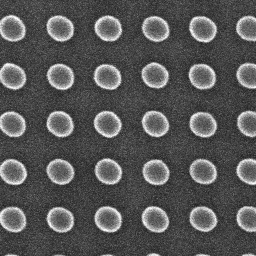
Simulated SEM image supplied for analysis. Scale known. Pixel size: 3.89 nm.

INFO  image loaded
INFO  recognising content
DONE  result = a regular array of raised bodies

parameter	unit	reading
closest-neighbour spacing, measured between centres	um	0.184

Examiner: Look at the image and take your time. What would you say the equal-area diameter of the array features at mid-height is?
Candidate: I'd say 98.9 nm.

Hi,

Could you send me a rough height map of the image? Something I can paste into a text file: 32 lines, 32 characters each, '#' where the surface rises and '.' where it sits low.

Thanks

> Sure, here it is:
................................
................................
##....##....###...##....##....##
###...###...###...###...###...##
###...###...###...###...###...##
................................
................................
................................
##....##....##....###...##....##
###...###...###...###...###...##
###...###...###...###...###...##
................................
................................
................................
##....###...##....###...##....##
###...###...###...###...###...##
.##...###...###...###...###...##
................................
................................
................................
###...###...###...###...##....##
###...###...###...###...###...##
.##....##....##...###...###...##
................................
................................
................................
###...###...###...##....##....##
###...###...###...###...###...##
.##....##...###...###...###...##
................................
................................
................................